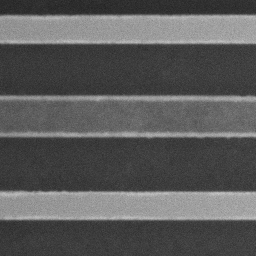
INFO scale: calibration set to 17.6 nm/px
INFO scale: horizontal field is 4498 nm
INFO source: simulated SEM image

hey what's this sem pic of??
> lines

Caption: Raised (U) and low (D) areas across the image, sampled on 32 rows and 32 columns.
DDDDDDDDDDDDDDDDDDDDDDDDDDDDDDDD
DDDDDDDDDDDDDDDDDDDDDDDDDDDDDDDD
UUUUUUUUUUUUUUUUUUUUUUUUUUUUUUUU
UUUUUUUUUUUUUUUUUUUUUUUUUUUUUUUU
UUUUUUUUUUUUUUUUUUUUUUUUUUUUUUUU
DDDDDDDDDDDDDDDDDDDDDDDDDDDDDDDD
DDDDDDDDDDDDDDDDDDDDDDDDDDDDDDDD
DDDDDDDDDDDDDDDDDDDDDDDDDDDDDDDD
DDDDDDDDDDDDDDDDDDDDDDDDDDDDDDDD
DDDDDDDDDDDDDDDDDDDDDDDDDDDDDDDD
DDDDDDDDDDDDDDDDDDDDDDDDDDDDDDDD
DDDDDDDDDDDDDDDDDDDDDDDDDDDDDDDD
UUUUUUUUUUUUUUUUUUUUUUUUUUUUUUUU
UUUUUUUUUUUUUUUUUUUUUUUUUUUUUUUU
UUUUUUUUUUUUUUUUUUUUUUUUUUUUUUUU
UUUUUUUUUUUUUUUUUUUUUUUUUUUUUUUU
UUUUUUUUUUUUUUUUUUUUUUUUUUUUUUUU
DDDDDDDDDDDDDDDDDDDDDDDDDDDDDDDD
DDDDDDDDDDDDDDDDDDDDDDDDDDDDDDDD
DDDDDDDDDDDDDDDDDDDDDDDDDDDDDDDD
DDDDDDDDDDDDDDDDDDDDDDDDDDDDDDDD
DDDDDDDDDDDDDDDDDDDDDDDDDDDDDDDD
DDDDDDDDDDDDDDDDDDDDDDDDDDDDDDDD
DDDDDDDDDDDDDDDDDDDDDDDDDDDDDDDD
UUUUUUUUUUUUUUUUUUUUUUUUUUUUUUUU
UUUUUUUUUUUUUUUUUUUUUUUUUUUUUUUU
UUUUUUUUUUUUUUUUUUUUUUUUUUUUUUUU
DDDDDDDDDDDDDDDDDDDDDDDDDDDDDDDD
DDDDDDDDDDDDDDDDDDDDDDDDDDDDDDDD
DDDDDDDDDDDDDDDDDDDDDDDDDDDDDDDD
DDDDDDDDDDDDDDDDDDDDDDDDDDDDDDDD
DDDDDDDDDDDDDDDDDDDDDDDDDDDDDDDD